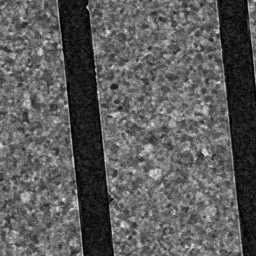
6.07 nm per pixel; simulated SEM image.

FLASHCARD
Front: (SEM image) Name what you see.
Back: one or a few lines or trenches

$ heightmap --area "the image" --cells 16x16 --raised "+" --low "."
++++..++++++++..
++++..++++++++..
++++..++++++++..
++++..++++++++..
++++..++++++++..
++++..++++++++..
++++..++++++++..
++++..++++++++..
++++..++++++++..
+++++..+++++++..
+++++..++++++++.
+++++..++++++++.
+++++..++++++++.
+++++..++++++++.
+++++..++++++++.
+++++..++++++++.